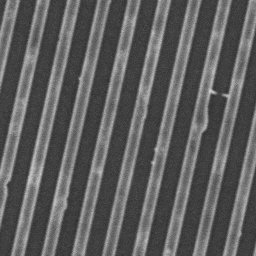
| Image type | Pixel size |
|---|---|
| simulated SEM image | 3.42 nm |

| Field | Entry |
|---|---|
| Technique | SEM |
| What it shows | parallel lines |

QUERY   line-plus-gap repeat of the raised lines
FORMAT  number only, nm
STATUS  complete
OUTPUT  101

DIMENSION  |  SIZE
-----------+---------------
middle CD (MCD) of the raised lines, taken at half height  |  39.6 nanometers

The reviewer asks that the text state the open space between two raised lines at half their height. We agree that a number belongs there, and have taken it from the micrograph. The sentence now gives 0.0613 um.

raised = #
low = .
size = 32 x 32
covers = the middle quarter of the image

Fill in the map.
.....###.....##.....###.....###.
.....###....###.....###....###..
.....##.....###.....###....###..
....###.....###....###.....###..
....###.....###....###.....###..
....###....###.....###.....##...
....###....###.....###....###...
...###.....###.....##.....###...
...###.....###....###.....###...
...###.....##.....###.....###...
...###....###.....###....###....
...##.....###.....###....###....
..###.....###....####....###....
..###.....###....###.....###....
..###....###.....###.....##.....
..###....###.....###....###.....
.###.....###.....##.....###.....
.###.....###....###.....###....#
.###.....##.....###.....###....#
.###....###.....###....###.....#
.##.....###.....###....###.....#
###.....###....###.....###.....#
###.....###....###.....###....##
###....###.....###.....##.....##
###....###.....###....###.....##
##.....###.....##.....###.....##
##.....###....###.....###....###
##.....##.....###.....###....###
##....###.....###....###.....###
#.....###.....###....###.....###
#.....###....###.....###.....##.
#.....###....###.....###....###.